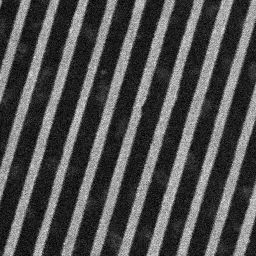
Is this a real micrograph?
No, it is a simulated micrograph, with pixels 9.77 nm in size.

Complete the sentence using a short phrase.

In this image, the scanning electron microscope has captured parallel lines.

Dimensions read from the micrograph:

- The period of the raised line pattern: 270 nm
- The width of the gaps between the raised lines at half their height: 0.187 micrometres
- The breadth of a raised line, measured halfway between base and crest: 0.0831 um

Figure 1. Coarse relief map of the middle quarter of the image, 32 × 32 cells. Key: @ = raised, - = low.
@-----@@-----@@@-----@@-----@@--
@-----@@-----@@-----@@-----@@@--
@-----@@-----@@-----@@-----@@---
-----@@-----@@@-----@@-----@@---
-----@@-----@@-----@@@-----@@---
-----@@-----@@-----@@-----@@@---
-----@------@@-----@@-----@@----
----@@-----@@------@@-----@@----
----@@-----@@-----@@-----@@@----
----@@-----@@-----@@-----@@@----
---@@-----@@@-----@------@@-----
---@@-----@@-----@@------@@----@
---@@-----@@-----@@-----@@-----@
--@@------@@-----@@-----@@-----@
--@@-----@@-----@@@-----@@-----@
--@@-----@@-----@@-----@@@----@@
--@------@@-----@@-----@@-----@@
-@@-----@@@-----@@-----@@-----@@
-@@-----@@-----@@-----@@@-----@@
-@------@@-----@@-----@@-----@@@
@@-----@@@-----@@-----@@-----@@-
@@-----@@-----@@@-----@@-----@@-
@@-----@@-----@@-----@@-----@@@-
@------@@-----@@-----@@-----@@@-
@-----@@-----@@@-----@@-----@@--
@-----@@-----@@-----@@@----@@@--
@-----@@-----@@-----@@-----@@@--
-----@@@-----@@-----@@-----@@---
-----@@-----@@------@@-----@@---
-----@@-----@@-----@@-----@@@---
-----@@-----@@-----@@-----@@----
----@@-----@@@----@@@-----@@----